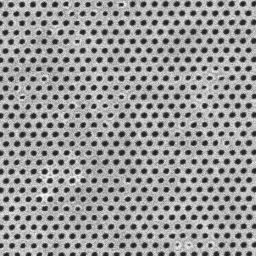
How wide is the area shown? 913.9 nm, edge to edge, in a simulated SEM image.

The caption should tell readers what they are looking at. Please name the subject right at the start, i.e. a regular array of holes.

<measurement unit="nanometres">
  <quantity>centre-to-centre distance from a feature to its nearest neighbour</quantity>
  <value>37.7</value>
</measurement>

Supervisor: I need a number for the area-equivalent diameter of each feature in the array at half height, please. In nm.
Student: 20.1